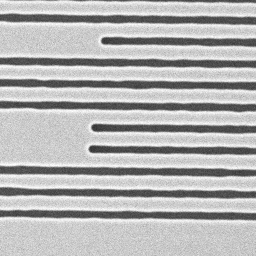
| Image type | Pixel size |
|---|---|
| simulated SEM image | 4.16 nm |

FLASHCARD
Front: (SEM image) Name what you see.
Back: groups of lines, slits or small figures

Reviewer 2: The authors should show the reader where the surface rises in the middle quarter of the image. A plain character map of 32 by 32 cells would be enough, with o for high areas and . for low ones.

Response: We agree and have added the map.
................................
oooooooooooooooooooooooooooooooo
oooooooooooooooooooooooooooooooo
oooooooooooooooooooooooooooooooo
................................
................................
oooooooooooooooooooooooooooooooo
oooooooooooooooooooooooooooooooo
oooooooooooooooooooooooooooooooo
...............ooooooooooooooooo
................................
....ooo.........................
oooooooooooooooooooooooooooooooo
oooooooooooooooooooooooooooooooo
oooooooooooooooooooooooooooooooo
ooooooo.........................
ooooooo.........................
oooooooooooooooooooooooooooooooo
oooooooooooooooooooooooooooooooo
oooooooooooooooooooooooooooooooo
ooooooo.....oooo..oooooooooooooo
oooooo..........................
ooooooo.........................
oooooooooooooooooooooooooooooooo
oooooooooooooooooooooooooooooooo
oooooooooooooooooooooooooooooooo
................................
................................
oooooooooooooooooooooooooooooooo
oooooooooooooooooooooooooooooooo
oooooooooooooooooooooooooooooooo
................................